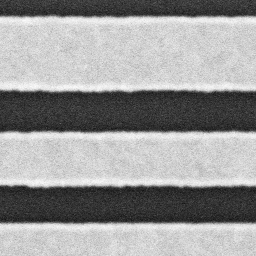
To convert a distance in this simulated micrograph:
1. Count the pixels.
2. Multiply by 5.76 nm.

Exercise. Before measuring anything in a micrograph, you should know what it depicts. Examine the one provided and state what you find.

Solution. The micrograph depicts lines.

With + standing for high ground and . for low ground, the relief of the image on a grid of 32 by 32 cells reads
................................
................................
++++++++++++++++++++++++++++++++
++++++++++++++++++++++++++++++++
++++++++++++++++++++++++++++++++
++++++++++++++++++++++++++++++++
++++++++++++++++++++++++++++++++
++++++++++++++++++++++++++++++++
++++++++++++++++++++++++++++++++
++++++++++++++++++++++++++++++++
++++++++++++++++++++++++++++++++
................................
................................
................................
................................
................................
................................
++++++++++++++++++++++++++++++++
++++++++++++++++++++++++++++++++
++++++++++++++++++++++++++++++++
++++++++++++++++++++++++++++++++
++++++++++++++++++++++++++++++++
++++++++++++++++++++++++++++++++
................................
................................
................................
................................
................................
++++++++++++++++++++++++++++++++
++++++++++++++++++++++++++++++++
++++++++++++++++++++++++++++++++
++++++++++++++++++++++++++++++++